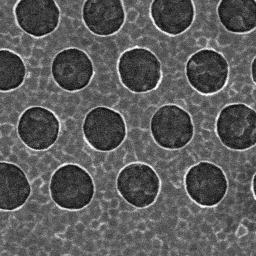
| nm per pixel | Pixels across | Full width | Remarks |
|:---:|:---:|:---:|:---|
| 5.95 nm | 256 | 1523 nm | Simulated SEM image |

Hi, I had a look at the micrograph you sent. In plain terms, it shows a regular array of holes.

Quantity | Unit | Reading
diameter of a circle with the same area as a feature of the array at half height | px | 43.4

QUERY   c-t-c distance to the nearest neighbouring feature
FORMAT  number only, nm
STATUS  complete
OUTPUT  392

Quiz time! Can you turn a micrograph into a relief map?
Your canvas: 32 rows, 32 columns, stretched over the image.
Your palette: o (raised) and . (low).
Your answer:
oo.....oooo....oooo.....ooo.....
oo.....ooo......ooo.....ooo.....
oo.....ooo......ooo.....oooo....
ooo....oooo....ooooo...ooooo....
oooo.ooooooooooooooooooooooooooo
oooooooooooooooooooooooooooooooo
..oooooo..oooooo...oooooo..ooooo
...oooo....oooo.....oooo....oooo
...oooo.....ooo.....ooo......oo.
...oooo.....ooo.....ooo.....oooo
...oooo....oooo.....oooo....oooo
ooooooooooooooooo.ooooooo..ooooo
oooooooooooooooooooooooooooooooo
oooo.ooooooo.ooooooo...ooooo...o
ooo....oooo....oooo.....ooo.....
oo.....ooo......ooo.....ooo.....
oo.....ooo......ooo.....ooo.....
ooo....oooo....oooo.....oooo....
oooo..oooooo..ooooooo..oooooo..o
oooooooooooooooooooooooooooooooo
..oooooooooooooo..ooooooo..ooooo
...oooo....oooo....oooo.....oooo
...ooo......ooo.....ooo.....oooo
....oo......ooo.....ooo.....oooo
....oo......ooo.....oooo....oooo
...oooo....ooooo...oooooo..ooooo
oooooooooooooooooooooooooooooooo
oooooooooooooooooooooooooooooooo
oooooooooooooooooooooooooooooooo
oooooooooooooooooooooooooooooooo
oooooooooooooooooooooooooooooooo
oooooooooooooooooooooooooooooooo